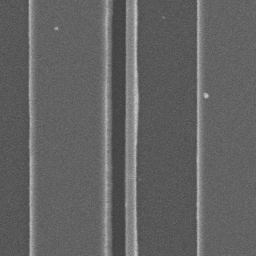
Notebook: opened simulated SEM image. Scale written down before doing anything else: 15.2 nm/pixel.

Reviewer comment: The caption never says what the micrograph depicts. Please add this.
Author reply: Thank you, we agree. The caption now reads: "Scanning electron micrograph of lines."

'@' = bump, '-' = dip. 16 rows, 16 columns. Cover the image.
--@@@@@-----@@@@
--@@@@@-----@@@@
--@@@@@-----@@@@
--@@@@@-----@@@@
--@@@@@-----@@@@
--@@@@@-----@@@@
--@@@@@-----@@@@
--@@@@@-----@@@@
--@@@@@-----@@@@
--@@@@@-----@@@@
--@@@@@-----@@@@
--@@@@@-----@@@@
--@@@@@-----@@@@
--@@@@@-----@@@@
--@@@@@-----@@@@
--@@@@@-----@@@@